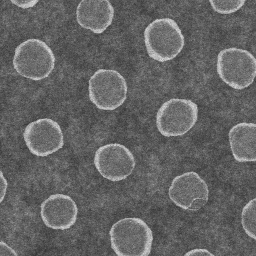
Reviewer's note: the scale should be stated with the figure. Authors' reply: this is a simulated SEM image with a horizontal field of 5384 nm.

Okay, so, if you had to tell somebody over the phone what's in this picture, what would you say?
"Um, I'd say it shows a regular array of raised bodies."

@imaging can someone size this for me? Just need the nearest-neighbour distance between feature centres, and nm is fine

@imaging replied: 1560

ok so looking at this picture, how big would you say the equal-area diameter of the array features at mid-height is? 777 nm